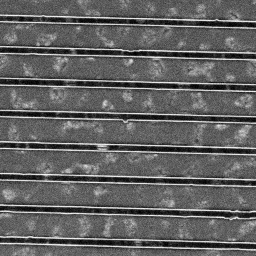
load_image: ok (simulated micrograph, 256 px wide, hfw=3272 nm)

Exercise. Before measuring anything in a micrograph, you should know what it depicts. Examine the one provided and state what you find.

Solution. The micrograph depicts parallel lines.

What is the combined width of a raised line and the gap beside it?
405 nm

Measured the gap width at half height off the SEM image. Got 313 nanometers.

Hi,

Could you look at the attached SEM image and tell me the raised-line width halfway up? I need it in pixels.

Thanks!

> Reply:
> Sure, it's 7.25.